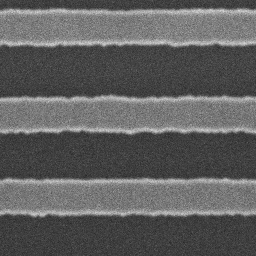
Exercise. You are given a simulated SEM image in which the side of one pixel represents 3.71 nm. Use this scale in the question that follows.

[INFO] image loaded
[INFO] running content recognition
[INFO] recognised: lines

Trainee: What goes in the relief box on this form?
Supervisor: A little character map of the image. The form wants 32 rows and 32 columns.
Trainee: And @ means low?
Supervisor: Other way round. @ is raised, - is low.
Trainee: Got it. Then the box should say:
--------------------------------
@@@@@@@@@@@@@@@@@@@@@@@@@@@@@@@@
@@@@@@@@@@@@@@@@@@@@@@@@@@@@@@@@
@@@@@@@@@@@@@@@@@@@@@@@@@@@@@@@@
@@@@@@@@@@@@@@@@@@@@@@@@@@@@@@@@
@@@@@@@@@@@@@@@@@@@@@@@@@@@@@@@@
--------------------------------
--------------------------------
--------------------------------
--------------------------------
--------------------------------
--------------------------------
@@@@@@@@@@@@@@@@@@@@@@@@@@@@@@@@
@@@@@@@@@@@@@@@@@@@@@@@@@@@@@@@@
@@@@@@@@@@@@@@@@@@@@@@@@@@@@@@@@
@@@@@@@@@@@@@@@@@@@@@@@@@@@@@@@@
@--@-----------@@--@------@-@--@
--------------------------------
--------------------------------
--------------------------------
--------------------------------
--------------------------------
@@@@@@@@@@-@@@@@@@@@@@@@@@@@@@@@
@@@@@@@@@@@@@@@@@@@@@@@@@@@@@@@@
@@@@@@@@@@@@@@@@@@@@@@@@@@@@@@@@
@@@@@@@@@@@@@@@@@@@@@@@@@@@@@@@@
@@@@@@@@@@@@@@@@@@@@@@@@@@@@@@@@
--------------------------------
--------------------------------
--------------------------------
--------------------------------
--------------------------------